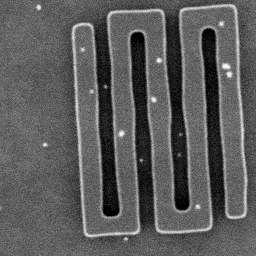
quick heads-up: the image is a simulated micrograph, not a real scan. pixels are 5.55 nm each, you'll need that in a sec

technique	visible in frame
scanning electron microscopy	groups of lines, slits or small figures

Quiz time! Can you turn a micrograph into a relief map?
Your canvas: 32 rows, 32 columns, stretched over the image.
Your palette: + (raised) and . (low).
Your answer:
................................
..............++++++...+++++++..
..............+++++++..+++++++..
.........+++..+++++++..+++++++..
.........+++..++..+++..++..+++..
.........+++..++..+++..++..+++..
.........+++..++..+++..++..+++..
.........+++..++..+++..++..+++..
.........+++..++..+++..++..+++..
.........+++..++..+++..++..+++..
.........+++..++..+++..+++.+++..
.........+++..+++.+++..+++.+++..
..........++..+++.+++..+++.+++..
..........++..+++..++..+++.+++..
..........++..+++..++..+++..++..
..........++..+++..++..+++..++..
..........++..+++..++..+++..++..
..........++..+++..++..+++..++..
..........+++.+++..++..+++..++..
..........+++.+++..++...++..++..
..........+++.+++..+++..++..+++.
..........+++..++..+++..++..+++.
..........+++..++..+++..++..+++.
..........+++..++..+++..++..+++.
..........+++..++..+++..++..+++.
..........+++..++..+++..++..+++.
..........+++..++..+++++++..+++.
...........++++++...++++++......
...........++++++...++++++......
................................
................................
................................